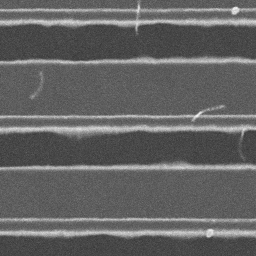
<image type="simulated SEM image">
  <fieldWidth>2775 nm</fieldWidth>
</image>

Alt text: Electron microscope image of lines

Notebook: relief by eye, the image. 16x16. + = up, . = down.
++++++++++++++++
................
................
................
++++++++++++++++
++++++++++++++++
++++++++++++++++
++++++++++++++++
................
................
.....+.++.+++.++
++++++++++++++++
++++++++++++++++
++++++++++++++++
+++++++++.++++++
................